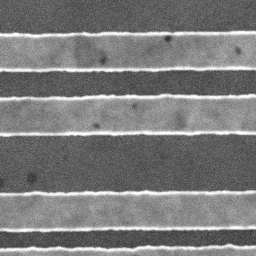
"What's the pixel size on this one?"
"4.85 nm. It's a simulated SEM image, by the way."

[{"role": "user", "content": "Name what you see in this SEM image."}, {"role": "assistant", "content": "lines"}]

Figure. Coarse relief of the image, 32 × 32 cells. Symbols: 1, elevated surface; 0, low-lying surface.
00000000000000000000000000000000
00000000000000000000000000000000
00000000000000000000000000000000
00000000000000000000000000000000
11111111111111111111111111111111
11111111111111111111111111111111
11111111111111111111111111111111
11111111111111111111111111111111
11111111111111111111111111111111
00000000000000000000000000000000
00000000000000000000000000000000
00000000000000000000000000000000
11111111111111111111111111111111
11111111111111111111111111111111
11111111111111111111111111111111
11111111111111111111111111111111
11111111111111111111111111111111
00000000000000000000000000000000
00000000000000000000000000000000
00000000000000000000000000000000
00000000000000000000000000000000
00000000000000000000000000000000
00000000000000000000000000000000
00000000000000000000000000000000
11111111111111111111111111111111
11111111111111111111111111111111
11111111111111111111111111111111
11111111111111111111111111111111
11111111111111111111111111111111
00000000000000000000000000000000
00000000000000000000000000000000
11111111111111111111111111111111